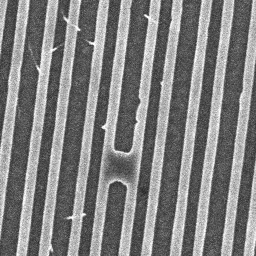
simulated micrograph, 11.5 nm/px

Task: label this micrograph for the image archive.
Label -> parallel lines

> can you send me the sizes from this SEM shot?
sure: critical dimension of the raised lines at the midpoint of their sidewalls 113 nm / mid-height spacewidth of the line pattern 203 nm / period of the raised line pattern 0.294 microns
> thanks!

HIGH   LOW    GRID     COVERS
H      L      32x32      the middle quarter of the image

HHLLLLLHHLLLHHHLLLLLHHLLLHHHLLLL
HHLLLLLHHLLLHHHLLLLLHHLLLHHLLLLL
HHLLLLLHHLLLHHLLLLLLHHLLLHHLLLLL
HHLLLLLHHLLLHHLLLLLHHHLLLHHLLLLL
HHLLLLHHHLLLHHLLLLLHHHLLLHHLLLLL
HHLLLLHHHLLLHHLLLLLHHHLLHHHLLLLL
HLLLLLHHHLLLHHLLLLLHHLLLLHHLLLLL
HLLLLLHHLLLLHHLLLLLHHLLLHHHLLLLL
HLLLLLHHLLLHHHLLLLLHHLLLHHHLLLLH
HLLLLLHHLLLHHHLLLLLHHLLLHHLLLLLH
HLLLLLHHLLLHHHLLLLLHHLLLHHLLLLLH
HLLLLLHHLLLHHHLLLLLHHLLLHHLLLLLH
HLLLLHHHLLLHHLLLLLHHHLLLHHLLLLLH
HLLLLHHLLLLHHLLLLLHHHLLLHHLLLLLH
LLLLLHHLLLLHHLLLLLHHLLLLHHLLLLLH
LLLLLHHLLLHHHLLLLLHHLLLHHHLLLLLH
LLLLLHHLLLHHHLLLLLHHLLLHHHLLLLHH
LLLLLHHLLLHHHLLLLLHHLLLHHLLLLLHH
LLLLLHHLLLHHLLLLLLHHLLLHHLLLLLHH
LLLLLHHLLLHHLLLLLHHHLLLHHLLLLLHH
LLLLHHHLLLHHLLLLLHHHLLLHHLLLLLHH
LLLLHHHLLLHHHLLLLHHHLLLHHLLLLLHH
LLLLHHHLLLHHHHHHHHHLLLLHHLLLLLHH
LLLLHHLLLLHHHHHHHHHLLLHHHLLLLLHH
LLLLHHLLLHHHHHHHHHHLLLHHHLLLLHHH
LLLLHHLLLHHHHHHHHHHLLLHHLLLLLHHH
LLLLHHLLLHHHHHHHHHHLLLHHLLLLLHHL
LLLLHHLLLHHHHHHHHHHLLLHHLLLLLHHL
LLLHHHLLLHHHHHHHHHHLLLHHLLLLLHHL
LLLHHLLLLHHHLLHHHHLLLLHHLLLLLHHL
LLLHHLLLLHHLLLLLHHLLLLHHLLLLLHHL
LLLHHLLLLHHLLLLLHHLLLHHHLLLLLHHL